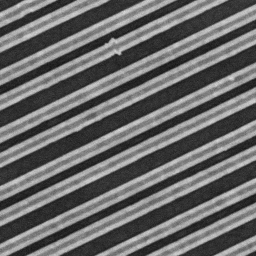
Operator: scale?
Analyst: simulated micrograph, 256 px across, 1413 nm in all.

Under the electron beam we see parallel lines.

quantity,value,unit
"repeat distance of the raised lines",143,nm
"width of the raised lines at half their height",52.1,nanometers